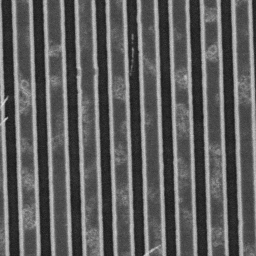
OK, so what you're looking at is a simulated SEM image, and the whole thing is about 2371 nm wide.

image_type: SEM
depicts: parallel lines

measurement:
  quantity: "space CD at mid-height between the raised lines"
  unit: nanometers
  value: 125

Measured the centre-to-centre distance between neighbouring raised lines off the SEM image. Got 0.29 micrometres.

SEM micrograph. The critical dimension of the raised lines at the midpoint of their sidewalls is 164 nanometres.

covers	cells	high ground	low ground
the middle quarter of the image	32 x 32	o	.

....oooo...ooooo...oooo....oooo.
....oooo...ooooo...ooooo...oooo.
....oooo...ooooo...ooooo...oooo.
....oooo...ooooo...oooo....oooo.
....oooo....oooo...ooooo...oooo.
....oooo....oooo...ooooo...ooooo
....oooo....oooo....oooo...oooo.
....oooo....oooo...ooooo...oooo.
....oooo....oooo...ooooo...ooooo
....oooo....oooo...ooooo...ooooo
....oooo....oooo....oooo....oooo
....oooo....oooo....oooo....oooo
....oooo....oooo....oooo....oooo
....oooo....oooo....oooo...ooooo
....oooo....oooo....oooo....oooo
....oooo....oooo....oooo....oooo
o...oooo....oooo....oooo....oooo
o...oooo....oooo....oooo....oooo
o...oooo....oooo....oooo....oooo
o...oooo....oooo....oooo....oooo
o...oooo....oooo....oooo....oooo
o...oooo....oooo....oooo....oooo
o...ooooo...oooo....oooo....oooo
o...ooooo...oooo....oooo....oooo
o...ooooo...oooo....oooo....oooo
o...ooooo...oooo....oooo....oooo
o...ooooo...oooo....oooo....oooo
o...ooooo...oooo....oooo....oooo
o....oooo...oooo....oooo....oooo
o....oooo...ooooo...ooooo...oooo
o....oooo...ooooo...oooo....oooo
o....oooo...ooooo...oooo....oooo